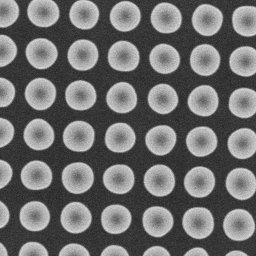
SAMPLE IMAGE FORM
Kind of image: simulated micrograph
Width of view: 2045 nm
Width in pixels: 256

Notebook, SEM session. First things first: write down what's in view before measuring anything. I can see an array of small figures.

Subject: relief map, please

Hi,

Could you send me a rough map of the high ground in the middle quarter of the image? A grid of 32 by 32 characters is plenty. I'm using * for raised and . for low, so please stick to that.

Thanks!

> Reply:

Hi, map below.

..******....******....*******...
....**.......****......*****....
................................
................................
..****..........................
.******.....*****......***......
.*******...*******....******....
********...*******...*******...*
********...*******...********..*
.*******...*******...********..*
.******....*******...*******...*
...**.......*****.....*****.....
................................
................................
..***...........................
.******.....****.......***......
*******....******....******.....
*******....*******...*******...*
*******...********..********...*
*******...********..********...*
*******....******....******....*
..****......****.....******....*
......................****......
................................
................................
.*****......****......***.......
*******....******....******.....
*******...*******...*******....*
*******...*******...********..**
*******...*******...********..**
*******...*******...********..**
.*****.....*****.....******....*